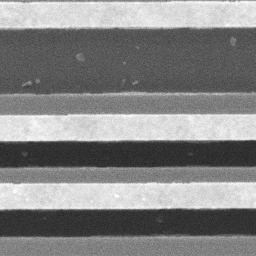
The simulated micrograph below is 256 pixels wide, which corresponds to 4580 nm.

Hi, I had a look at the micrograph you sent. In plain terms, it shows lines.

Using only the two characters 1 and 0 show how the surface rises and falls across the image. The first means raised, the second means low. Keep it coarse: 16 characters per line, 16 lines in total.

1111111111111111
1111111111111111
0000000000000000
0000000000000000
0000000000000000
0000000000000000
1111111111111111
1111111111111111
1111111111111111
0000000000000000
0000000000011001
1111111111111111
1111111111111111
0000000000000000
0000000000000000
1111111111111111